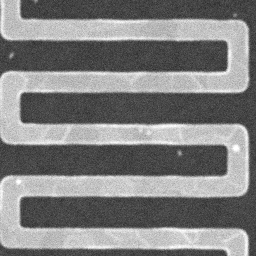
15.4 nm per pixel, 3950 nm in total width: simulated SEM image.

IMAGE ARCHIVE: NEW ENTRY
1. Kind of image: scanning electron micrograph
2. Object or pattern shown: groups of lines, slits or small figures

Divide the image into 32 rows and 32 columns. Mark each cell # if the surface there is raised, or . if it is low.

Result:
##..............................
##..............................
###.............................
###############################.
.##############################.
.............................##.
.............................##.
.............................##.
.............................##.
###############################.
###############################.
###.............................
##..............................
##..............................
##..............................
###.............................
###############################.
###############################.
............................###.
.............................##.
.............................##.
............................###.
###############################.
###############################.
###....................####.....
##..............................
##..............................
##..............................
###.............................
###############################.
###############################.
............................###.